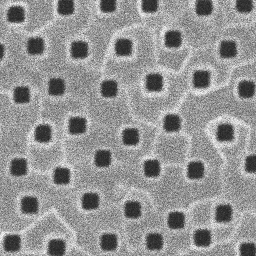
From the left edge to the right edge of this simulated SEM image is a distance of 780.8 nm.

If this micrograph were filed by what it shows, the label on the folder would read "a regular array of holes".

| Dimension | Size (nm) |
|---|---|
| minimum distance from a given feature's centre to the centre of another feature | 118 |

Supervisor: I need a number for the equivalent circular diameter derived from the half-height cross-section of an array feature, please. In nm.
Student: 57.1